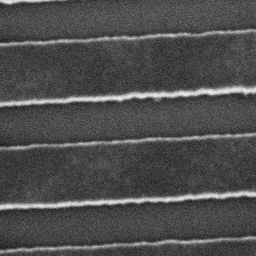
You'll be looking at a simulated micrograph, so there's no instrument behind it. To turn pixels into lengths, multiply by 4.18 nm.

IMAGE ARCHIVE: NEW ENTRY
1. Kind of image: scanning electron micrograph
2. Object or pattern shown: lines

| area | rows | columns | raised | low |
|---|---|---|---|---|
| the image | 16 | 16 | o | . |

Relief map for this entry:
................
................
.....ooooooooooo
oooooooooooooooo
oooooooooooooooo
oooooooooooooooo
oo..............
................
.............ooo
oooooooooooooooo
oooooooooooooooo
oooooooooooooooo
ooooooooooo.....
................
................
...ooooooooooooo